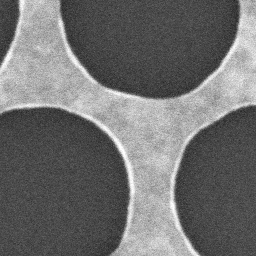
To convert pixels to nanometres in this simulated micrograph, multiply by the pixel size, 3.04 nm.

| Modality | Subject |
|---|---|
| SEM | holes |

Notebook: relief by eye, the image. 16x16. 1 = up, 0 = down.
0111000000000001
0111000000000001
0111000000000001
1111000000000011
1111100000000111
1111111000001111
1111111111111111
0000001111111100
0000000111110000
0000000011100000
0000000011100000
0000000011100000
0000000011100000
0000000011100000
0000000011100000
0000000111110000